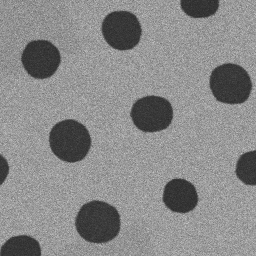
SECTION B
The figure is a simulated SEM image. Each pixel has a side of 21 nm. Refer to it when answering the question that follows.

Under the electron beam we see holes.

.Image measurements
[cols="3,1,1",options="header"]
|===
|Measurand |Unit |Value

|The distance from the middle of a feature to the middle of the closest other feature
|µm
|1.8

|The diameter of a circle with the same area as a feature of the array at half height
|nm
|833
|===